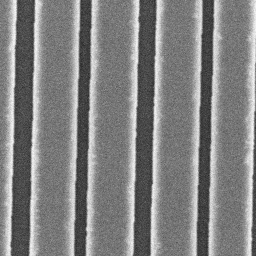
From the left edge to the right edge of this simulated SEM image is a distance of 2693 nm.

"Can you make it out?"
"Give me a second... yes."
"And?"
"lines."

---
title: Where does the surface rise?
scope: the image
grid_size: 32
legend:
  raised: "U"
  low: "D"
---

UUDDDUUUUUDDUUUUUDDDUUUUUDDUUUUU
UUDDDUUUUUDDUUUUUDDDUUUUUDDUUUUU
UUDDDUUUUUDDUUUUUDDDUUUUUDDUUUUU
UUDDDUUUUUDDUUUUUDDDUUUUUDDUUUUU
UUDDDUUUUUDDUUUUUDDDUUUUUDDUUUUU
UUDDDUUUUUDDUUUUUDDDUUUUUDDUUUUU
UUDDDUUUUUDDUUUUUDDDUUUUUDDUUUUU
UUDDDUUUUUDDUUUUUDDDUUUUUDDUUUUU
UUDDUUUUUUDDUUUUUDDDUUUUUDDUUUUU
UUDDUUUUUUDDUUUUUDDDUUUUUDDUUUUU
UUDDUUUUUUDDUUUUUDDDUUUUUDDUUUUU
UUDDUUUUUDDDUUUUUDDDUUUUUDDUUUUU
UUDDUUUUUDDUUUUUUDDDUUUUUDDUUUUU
UUDDUUUUUDDUUUUUUDDDUUUUUDDUUUUU
UDDDUUUUUDDUUUUUUDDDUUUUUDDUUUUU
UDDDUUUUUDDUUUUUUDDUUUUUUDDUUUUD
UDDDUUUUUDDUUUUUUDDUUUUUUDDUUUUD
UDDDUUUUUDDUUUUUUDDUUUUUUDDUUUUD
UDDDUUUUUDDUUUUUUDDUUUUUUDDUUUUD
UDDDUUUUUDDUUUUUUDDUUUUUUDDUUUUD
UDDDUUUUUDDUUUUUUDDUUUUUUDUUUUUD
UDDDUUUUUDDUUUUUUDDUUUUUUDUUUUUD
UDDDUUUUUDDUUUUUUDDUUUUUUDUUUUUD
UDDDUUUUUDDUUUUUUDDUUUUUUDUUUUUD
UDDDUUUUUDDUUUUUUDDUUUUUUDUUUUUD
UDDDUUUUUDDUUUUUUDDUUUUUDDUUUUUD
UDDDUUUUUDDUUUUUUDDUUUUUDDUUUUUD
UDDDUUUUUDDUUUUUUDDUUUUUDDUUUUUD
UDDDUUUUUDDUUUUUUDDUUUUUDDUUUUUD
UDDDUUUUUDDUUUUUUDDUUUUUDDUUUUUD
UDDDUUUUUDDUUUUUDDDUUUUUDDUUUUUD
UDDDUUUUUDDUUUUUDDDUUUUUDDUUUUUD